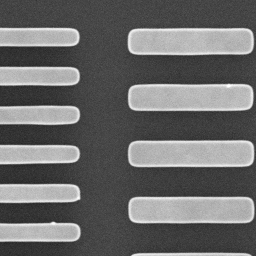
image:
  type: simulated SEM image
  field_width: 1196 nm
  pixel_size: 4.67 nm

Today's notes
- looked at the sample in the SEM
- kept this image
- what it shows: groups of lines, slits or small figures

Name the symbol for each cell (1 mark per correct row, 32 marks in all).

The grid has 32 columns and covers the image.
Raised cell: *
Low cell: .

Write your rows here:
................................
................................
................................
................................
**********......****************
*********.......****************
................***************.
................................
*********.......................
**********......................
*********.......................
................****************
................****************
**********......***************.
**********......................
....****........................
................................
................................
**********......****************
**********......****************
................***************.
................................
................................
**********......................
**********......................
................****************
................****************
................***************.
**********......................
**********......................
................................
................................